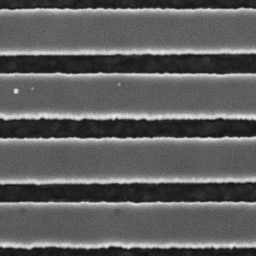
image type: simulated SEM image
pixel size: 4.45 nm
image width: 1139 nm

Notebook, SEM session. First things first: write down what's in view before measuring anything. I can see lines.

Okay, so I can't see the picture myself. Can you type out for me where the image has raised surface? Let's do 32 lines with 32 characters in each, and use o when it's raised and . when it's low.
................................
oooooooooooooooooooooooooooooooo
oooooooooooooooooooooooooooooooo
oooooooooooooooooooooooooooooooo
oooooooooooooooooooooooooooooooo
oooooooooooooooooooooooooooooooo
oooooooooooooooooooooooooooooooo
................................
................................
oooooooooooooooooooooooooooooooo
oooooooooooooooooooooooooooooooo
oooooooooooooooooooooooooooooooo
oooooooooooooooooooooooooooooooo
oooooooooooooooooooooooooooooooo
oooooooooooooooooooooooooooooooo
................................
................................
oooooooooooooooooooooooooooooooo
oooooooooooooooooooooooooooooooo
oooooooooooooooooooooooooooooooo
oooooooooooooooooooooooooooooooo
oooooooooooooooooooooooooooooooo
oooooooooooooooooooooooooooooooo
................................
................................
oooooooooooooooooooooooooooooooo
oooooooooooooooooooooooooooooooo
oooooooooooooooooooooooooooooooo
oooooooooooooooooooooooooooooooo
oooooooooooooooooooooooooooooooo
oooooooooooooooooooooooooooooooo
................................